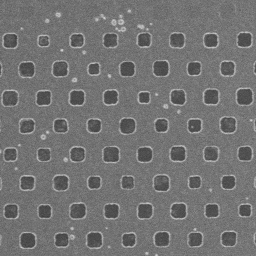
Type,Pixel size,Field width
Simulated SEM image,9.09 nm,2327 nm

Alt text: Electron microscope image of a regular array of holes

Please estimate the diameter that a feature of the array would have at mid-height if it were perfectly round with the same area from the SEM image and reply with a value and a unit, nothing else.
16.1 px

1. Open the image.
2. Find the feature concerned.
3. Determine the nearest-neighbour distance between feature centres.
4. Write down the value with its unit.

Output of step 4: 32.7 px